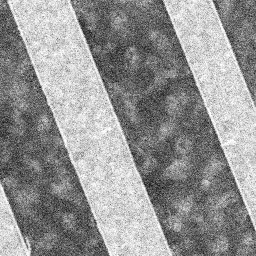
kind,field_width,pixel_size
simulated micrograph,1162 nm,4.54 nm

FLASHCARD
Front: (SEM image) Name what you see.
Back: one or a few lines or trenches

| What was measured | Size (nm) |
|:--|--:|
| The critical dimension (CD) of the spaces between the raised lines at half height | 398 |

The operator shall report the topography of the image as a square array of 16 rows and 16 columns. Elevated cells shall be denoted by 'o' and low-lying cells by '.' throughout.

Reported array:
.ooo......ooo...
.oooo......ooo..
..ooo......ooo..
..oooo......ooo.
..oooo......ooo.
...ooo......ooo.
...oooo......ooo
....ooo......ooo
....oooo......oo
....oooo......oo
.....ooo......oo
.....oooo......o
......ooo......o
o.....oooo......
o.....oooo......
oo.....oooo.....